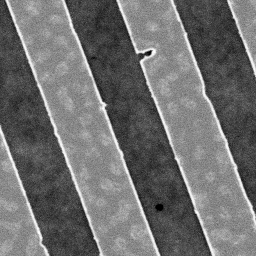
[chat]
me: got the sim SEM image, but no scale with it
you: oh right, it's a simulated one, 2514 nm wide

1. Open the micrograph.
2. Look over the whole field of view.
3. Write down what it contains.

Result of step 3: one or a few lines or trenches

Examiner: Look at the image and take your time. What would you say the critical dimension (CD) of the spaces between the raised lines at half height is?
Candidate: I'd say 0.492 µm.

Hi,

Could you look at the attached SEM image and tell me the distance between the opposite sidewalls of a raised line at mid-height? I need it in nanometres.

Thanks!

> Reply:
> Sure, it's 519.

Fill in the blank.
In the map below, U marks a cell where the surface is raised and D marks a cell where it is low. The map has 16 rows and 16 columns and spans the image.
DUUUDDDUUUUDDDUU
DUUUDDDDUUUDDDDU
DUUUUDDDUUUUDDDU
DDUUUDDDDUUUDDDD
DDUUUUDDDUUUDDDD
DDUUUUDDDUUUUDDD
DDDUUUDDDDUUUDDD
DDDUUUUDDDUUUUDD
DDDDUUUDDDDUUUDD
UDDDUUUUDDDUUUDD
UDDDUUUUDDDUUUUD
UDDDDUUUDDDDUUUD
UUDDDUUUUDDDUUUU
UUDDDUUUUDDDUUUU
UUDDDDUUUDDDDUUU
UUUDDDUUUUDDDUUU